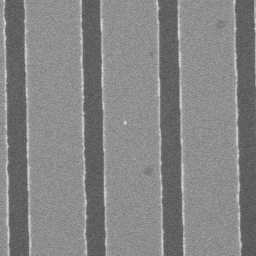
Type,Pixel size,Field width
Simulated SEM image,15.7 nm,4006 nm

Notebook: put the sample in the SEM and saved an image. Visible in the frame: lines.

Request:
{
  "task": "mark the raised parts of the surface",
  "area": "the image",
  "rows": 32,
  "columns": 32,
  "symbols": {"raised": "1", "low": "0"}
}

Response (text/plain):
10011111110001111111001111111000
00011111110001111111001111111000
10011111110001111111001111111000
10011111110001111111001111111000
10011111110001111111001111111000
10011111110001111111001111111000
10011111110001111111001111111000
10011111110001111111001111111000
10011111110001111111001111111100
10011111110001111111000111111100
10011111110001111111000111111100
10011111110001111111000111111100
10011111110001111111000111111100
10011111110001111111000111111100
10011111110001111111000111111100
10011111110001111111000111111100
10011111110001111111000111111100
10011111110001111111000111111100
10011111111001111111000111111100
10011111111001111111000111111100
10001111111001111111000111111100
10001111111001111111000111111100
10001111111001111111000111111100
10001111111001111111000111111100
10001111111001111111000111111100
10001111111001111111000111111100
10001111111001111111000111111100
10001111111001111111000111111100
10001111111001111111000111111100
10001111111001111111000111111100
10001111111001111111000111111100
10001111111001111111000111111100